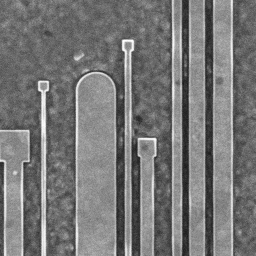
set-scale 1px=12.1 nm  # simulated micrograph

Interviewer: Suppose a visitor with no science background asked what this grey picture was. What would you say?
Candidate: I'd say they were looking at groups of lines, slits or small figures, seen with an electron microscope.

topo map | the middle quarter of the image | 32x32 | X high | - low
---------------XX----------XX--X
---------------XX----------XX--X
------XXXX-----XX----------XX--X
-----XXXXXX----XX----------XX--X
----XXXXXXXX---XX----------XX--X
---XXXXXXXXXX--XX----------XX--X
---XXXXXXXXXX--XX----------XX--X
---XXXXXXXXXX--XX----------XX--X
---XXXXXXXXXX--XX----------XX--X
---XXXXXXXXXX--XX----------XX--X
---XXXXXXXXXX--XX----------XX--X
---XXXXXXXXXX--XX----------XX--X
---XXXXXXXXXX--XX----------XX--X
---XXXXXXXXXX--XX----------XX--X
---XXXXXXXXXX--XX----------XX--X
---XXXXXXXXXX--XX----------XX--X
---XXXXXXXXXX--XX----------XX--X
---XXXXXXXXXX--XX----------XX--X
---XXXXXXXXXX--XX----------XX--X
---XXXXXXXXXX--XX--XXXX----XX--X
---XXXXXXXXXX--XX--XXXX----XX--X
---XXXXXXXXXX--XX--XXXX----XX--X
---XXXXXXXXXX--XX--XXXX----XX--X
---XXXXXXXXXX--XX--XXX-----XX--X
---XXXXXXXXXX--XX--XXX-----XX--X
---XXXXXXXXXX--XX--XXX-----XX--X
---XXXXXXXXXX--XX--XXX-----XX--X
---XXXXXXXXXX--XX--XXX-----XX--X
---XXXXXXXXXX--XX--XXX-----XX--X
---XXXXXXXXXX--XX--XXX-----XX--X
---XXXXXXXXXX--XX--XXX-----XX--X
---XXXXXXXXXX--XX--XXX-----XX--X